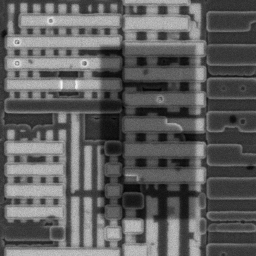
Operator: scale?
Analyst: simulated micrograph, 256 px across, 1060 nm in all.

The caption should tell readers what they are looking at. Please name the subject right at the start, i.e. wiring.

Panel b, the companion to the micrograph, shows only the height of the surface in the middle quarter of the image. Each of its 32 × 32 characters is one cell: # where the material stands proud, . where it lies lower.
###############.................
################################
...............#################
....#####.....##################
...############.................
...###########..................
...###########..................
...............#################
..............##########.#######
################################
################################
##############..................
................................
...............###########......
...............###########......
...............##############...
...............###############..
................................
................................
..........####.#################
..........######################
..........######################
..........######################
...............#################
................................
..........####..................
..........######################
..........######################
..................##############
..................##############
..........####..................
..........####..................